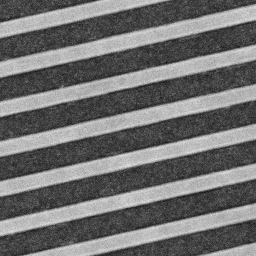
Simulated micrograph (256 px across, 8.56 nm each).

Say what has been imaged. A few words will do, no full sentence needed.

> parallel lines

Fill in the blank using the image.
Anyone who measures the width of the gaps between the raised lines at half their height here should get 212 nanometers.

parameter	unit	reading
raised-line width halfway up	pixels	13.7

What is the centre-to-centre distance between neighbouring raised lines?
331 nm